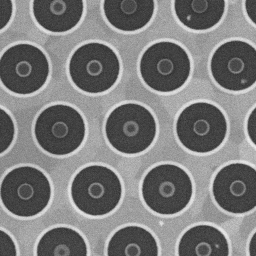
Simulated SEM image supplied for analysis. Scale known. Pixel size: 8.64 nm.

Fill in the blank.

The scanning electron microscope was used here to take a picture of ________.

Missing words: an array of small figures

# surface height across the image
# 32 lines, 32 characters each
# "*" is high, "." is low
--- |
..**.......**......***......**..
..**.......**......***......***.
.***......***......***......***.
.****....*****....*****....*****
********************************
**..******...******...******...*
.....****.....****.....****.....
......***......**.......**......
......**.......**.......**......
......***......***......**......
......***.....****.....****.....
*....*****...*******..*******.**
********************************
******...*****....*****....*****
.****.....***......***......***.
..**.......**.......**.......**.
..**.......**.......**.......**.
..**.......**......***......***.
.****.....****.....****....*****
*******.************************
********************..******...*
*....*****....****.....****.....
......***......***......***.....
......***......***......**......
......***......***......***.....
......***......***......***.....
*....*****....*****....*****...*
********************************
*******..******...******...*****
.****.....****.....****.....***.
..***......**.......**.......**.
..**.......**.......**.......**.